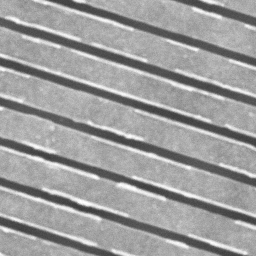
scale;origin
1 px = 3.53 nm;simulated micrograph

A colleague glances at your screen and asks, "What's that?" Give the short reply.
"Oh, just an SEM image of parallel lines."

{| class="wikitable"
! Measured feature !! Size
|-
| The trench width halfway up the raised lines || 32.4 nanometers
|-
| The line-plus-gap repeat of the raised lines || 134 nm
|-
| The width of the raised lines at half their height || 100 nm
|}